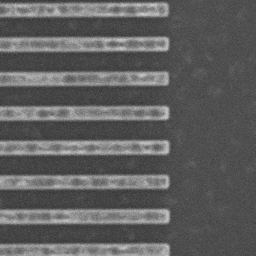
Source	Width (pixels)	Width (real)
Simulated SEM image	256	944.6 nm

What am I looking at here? parallel lines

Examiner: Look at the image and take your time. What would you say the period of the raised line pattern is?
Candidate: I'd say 0.127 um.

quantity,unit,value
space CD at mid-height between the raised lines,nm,84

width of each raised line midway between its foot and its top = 45.2 nm